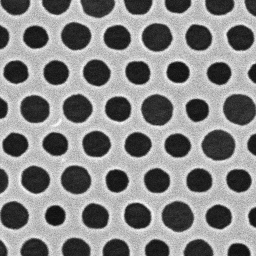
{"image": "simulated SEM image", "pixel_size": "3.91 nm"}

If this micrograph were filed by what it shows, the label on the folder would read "a regular array of holes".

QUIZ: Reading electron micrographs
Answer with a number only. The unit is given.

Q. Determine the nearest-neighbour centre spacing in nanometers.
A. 157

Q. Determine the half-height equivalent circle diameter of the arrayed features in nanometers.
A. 102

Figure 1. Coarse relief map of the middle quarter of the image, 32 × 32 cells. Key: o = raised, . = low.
.oooo......ooooo.....ooooo.....o
.oooo.......ooo.......oooo.....o
.oooo.......ooo.......oooo......
.oooo.......oooo.....ooooo.....o
oooooo.....oooooo....oooooo...oo
ooooooo...oooooooooooooooooooooo
oooooooooooooooooooooooooooooooo
oooooooooooooooooooooooooooooooo
o.....oooooo....ooooo.....oooooo
.......oooo.....oooo.......oooo.
.......ooo.......oo........ooo..
.......ooo.......oo........ooo..
.......ooo.......oo........oooo.
o.....ooooo.....oooo.......oooo.
oo...oooooooooooooooo.....oooooo
ooooooooooooooooooooooo..ooooooo
oooooooooooooooooooooooooooooooo
oooooo....oooooo....oooooooo.ooo
.oooo......ooooo.....ooooo.....o
.ooo........ooo.......ooo......o
.oooo.......ooo.......ooo.......
.oooo......oooo......oooo.......
oooooo.....ooooo.....ooooo.....o
oooooooooooooooooooooooooooo.ooo
oooooooooooooooooooooooooooooooo
o...oooooooooooooooooooooooooooo
......oooooo..ooooooo....ooooooo
......ooooo.....oooo......ooooo.
.......ooo......oooo......oooo..
.......ooo......oooo.......ooo..
.......oooo.....oooo......ooooo.
......ooooo....oooooo....ooooooo